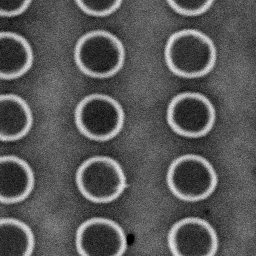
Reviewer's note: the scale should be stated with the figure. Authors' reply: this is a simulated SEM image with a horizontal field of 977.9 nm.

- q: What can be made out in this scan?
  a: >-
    raised bodies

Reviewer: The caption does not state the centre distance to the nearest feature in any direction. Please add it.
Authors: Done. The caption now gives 239 nm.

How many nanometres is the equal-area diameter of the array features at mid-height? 166